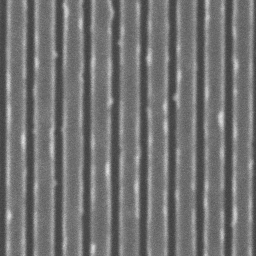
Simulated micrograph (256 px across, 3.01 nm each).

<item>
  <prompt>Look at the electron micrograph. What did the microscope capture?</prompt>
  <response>parallel lines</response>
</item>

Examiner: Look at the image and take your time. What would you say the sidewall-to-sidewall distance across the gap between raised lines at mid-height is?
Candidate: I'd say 9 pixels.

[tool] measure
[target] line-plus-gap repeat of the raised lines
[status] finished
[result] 85.2 nm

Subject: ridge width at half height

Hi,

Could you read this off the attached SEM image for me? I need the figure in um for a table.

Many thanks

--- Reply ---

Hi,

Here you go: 0.0595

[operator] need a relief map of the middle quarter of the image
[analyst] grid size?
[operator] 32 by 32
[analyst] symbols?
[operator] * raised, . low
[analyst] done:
*****..*****..*****..*****..****
*****..*****..*****..*****..****
*****..*****..*****..*****..****
*****..*****..*****..*****..****
*****..*****..*****..*****..****
*****..*****..*****..*****..****
*****..*****..*****..*****..****
*****..*****..*****..*****..****
****...*****..*****..*****.*****
****...*****..*****..*****..****
****...*****..*****..*****..****
****...****...*****..*****..****
****...****...*****..*****..****
****...****...*****..*****..****
****...****...*****..*****..****
****...****...*****..*****..****
****...*****..*****..*****..****
****...*****..*****..*****..****
*****..****...*****..*****..****
*****..****...*****..*****..****
*****..****...*****..*****..****
*****..****...*****..*****..****
*****..****...*****..*****..****
*****..****...*****..*****..****
*****..****...*****..*****..****
*****..****...*****..*****..****
*****..****...*****..*****..****
****...****...*****..*****..****
****...****...*****..*****..****
*****..****...*****..*****..****
*****..*****..*****..*****..****
*****..*****..*****..*****..****